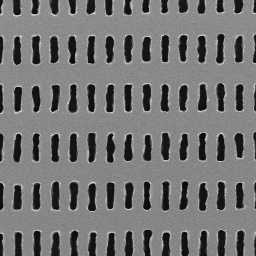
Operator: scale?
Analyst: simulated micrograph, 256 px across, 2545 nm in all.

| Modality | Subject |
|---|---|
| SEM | a regular array of holes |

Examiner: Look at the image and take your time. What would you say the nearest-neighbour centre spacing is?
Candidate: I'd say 181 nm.